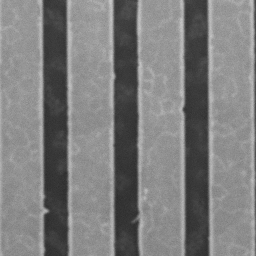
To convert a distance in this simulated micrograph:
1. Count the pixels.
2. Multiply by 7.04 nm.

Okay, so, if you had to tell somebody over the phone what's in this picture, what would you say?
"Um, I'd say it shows one or a few lines or trenches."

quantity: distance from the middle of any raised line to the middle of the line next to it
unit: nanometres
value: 496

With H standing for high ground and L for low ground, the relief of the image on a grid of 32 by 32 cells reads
HHHHHLLLLHHHHHLLLHHHHHHLLLHHHHHH
HHHHHLLLLHHHHHLLLHHHHHHLLLHHHHHL
HHHHHLLLLHHHHHLLLHHHHHHLLLHHHHHL
HHHHHLLLLHHHHHLLLHHHHHHLLLHHHHHH
HHHHHLLLLHHHHHLLLHHHHHHLLLHHHHHH
HHHHHLLLLHHHHHLLLHHHHHHLLLHHHHHH
HHHHHLLLLHHHHHLLLHHHHHHLLLHHHHHH
HHHHHLLLLHHHHHLLLHHHHHHLLLHHHHHH
HHHHHLLLLHHHHHLLLHHHHHHLLLHHHHHH
HHHHHLLLLHHHHHLLLLHHHHHLLLHHHHHH
HHHHHLLLLHHHHHLLLLHHHHHLLLHHHHHH
HHHHHLLLLHHHHHLLLLHHHHHLLLHHHHHH
HHHHHLLLLHHHHHLLLLHHHHHLLLHHHHHH
HHHHHLLLLHHHHHLLLLHHHHHLLLHHHHHL
HHHHHLLLLHHHHHLLLLHHHHHLLLHHHHHH
HHHHHLLLLHHHHHLLLHHHHHHLLLHHHHHH
HHHHHLLLLHHHHHLLLHHHHHHLLLHHHHHH
HHHHHLLLLHHHHHLLLHHHHHHLLLHHHHHH
HHHHHLLLLHHHHHLLLHHHHHHLLLHHHHHH
HHHHHLLLLHHHHHLLLLHHHHHLLLHHHHHH
HHHHHLLLLHHHHHLLLHHHHHHLLLHHHHHH
HHHHHLLLLHHHHHLLLHHHHHHLLLHHHHHH
HHHHHLLLLHHHHHLLLLHHHHHLLLHHHHHH
HHHHHLLLLHHHHHLLLLHHHHHLLLHHHHHH
HHHHHLLLLHHHHHLLLHHHHHHLLLHHHHHH
HHHHHLLLLHHHHHLLLHHHHHHLLLHHHHHH
HHHHHHLLLHHHHHLLLHHHHHHLLLHHHHHH
HHHHHLLLLHHHHHLLLHHHHHHLLLHHHHHH
HHHHHLLLLHHHHHLLLLHHHHHLLLHHHHHH
HHHHHLLLLHHHHHLLLLHHHHHLLLHHHHHH
HHHHHLLLLHHHHHLLLLHHHHHLLLHHHHHH
HHHHHLLLLHHHHHLLLLHHHHHLLLHHHHHH